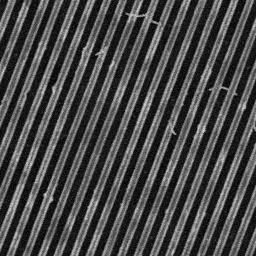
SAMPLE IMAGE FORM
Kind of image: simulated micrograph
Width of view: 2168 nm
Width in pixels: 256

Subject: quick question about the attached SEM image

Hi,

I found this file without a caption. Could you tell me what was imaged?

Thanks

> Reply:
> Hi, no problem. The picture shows parallel lines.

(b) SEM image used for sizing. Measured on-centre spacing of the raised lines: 126 nanometers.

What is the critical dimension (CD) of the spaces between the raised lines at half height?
0.0782 µm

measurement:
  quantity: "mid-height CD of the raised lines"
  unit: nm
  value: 46.5